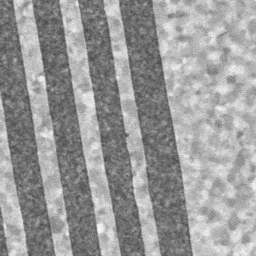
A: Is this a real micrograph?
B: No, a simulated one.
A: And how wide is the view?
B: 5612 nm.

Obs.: parallel lines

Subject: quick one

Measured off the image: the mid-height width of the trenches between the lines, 616 nm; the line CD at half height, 374 nm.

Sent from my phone